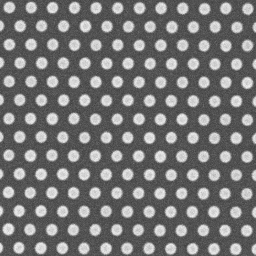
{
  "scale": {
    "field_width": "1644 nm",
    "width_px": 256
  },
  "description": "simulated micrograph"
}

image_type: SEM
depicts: a regular array of raised bodies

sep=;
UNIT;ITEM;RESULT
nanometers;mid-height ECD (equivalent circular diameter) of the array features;70.2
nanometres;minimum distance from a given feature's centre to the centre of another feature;135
